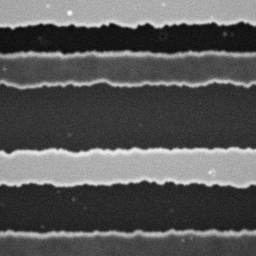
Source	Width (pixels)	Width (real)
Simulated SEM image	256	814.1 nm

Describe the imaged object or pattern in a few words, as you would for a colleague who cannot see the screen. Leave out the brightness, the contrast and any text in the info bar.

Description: lines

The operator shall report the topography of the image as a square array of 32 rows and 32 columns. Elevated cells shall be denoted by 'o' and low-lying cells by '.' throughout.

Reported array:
oooooooooooooooooooooooooooooooo
oooooooooooooooooooooooooooooooo
oooooooooooooooooooooooooooooooo
................................
................................
................................
...o.......o...oo......o.ooo....
oooooooooooooooooooooooooooooooo
oooooooooooooooooooooooooooooooo
oooooooooooooooooooooooooooooooo
oooooooooooo..oooooooooooo...ooo
................................
................................
................................
................................
................................
................................
................................
.............................o..
oooooooooooooooooooooooooooooooo
oooooooooooooooooooooooooooooooo
oooooooooooooooooooooooooooooooo
oooooooooooooooooooooooooooooooo
................................
................................
................................
................................
................................
................................
oooooooooooooooooooooooooooooooo
oooooooooooooooooooooooooooooooo
oooooooooooooooooooooooooooooooo